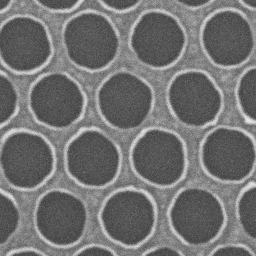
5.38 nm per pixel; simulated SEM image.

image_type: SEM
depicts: a regular array of holes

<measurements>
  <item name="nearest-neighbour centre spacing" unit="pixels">67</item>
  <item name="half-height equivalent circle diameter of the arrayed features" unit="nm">289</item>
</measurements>